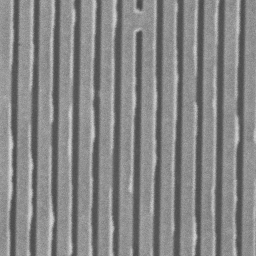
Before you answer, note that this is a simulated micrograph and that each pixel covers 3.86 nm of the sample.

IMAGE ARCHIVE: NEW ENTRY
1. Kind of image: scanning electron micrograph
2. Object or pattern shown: parallel lines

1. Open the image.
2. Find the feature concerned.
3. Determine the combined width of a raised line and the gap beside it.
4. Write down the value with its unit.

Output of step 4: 0.0793 micrometres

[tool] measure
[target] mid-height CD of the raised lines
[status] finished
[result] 53.5 nm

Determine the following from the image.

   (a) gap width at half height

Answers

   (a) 24.6 nanometres